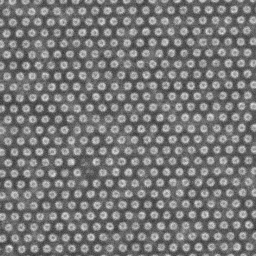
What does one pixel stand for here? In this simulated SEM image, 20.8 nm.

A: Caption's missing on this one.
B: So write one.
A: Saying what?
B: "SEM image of a regular array of raised bodies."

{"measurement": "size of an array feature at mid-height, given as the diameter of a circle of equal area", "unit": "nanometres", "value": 127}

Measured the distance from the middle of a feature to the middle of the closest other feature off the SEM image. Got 250 nanometers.